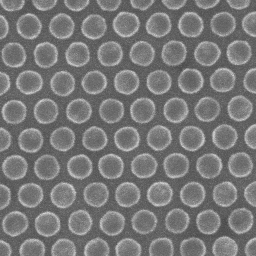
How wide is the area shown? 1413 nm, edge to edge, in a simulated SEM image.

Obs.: a regular array of raised bodies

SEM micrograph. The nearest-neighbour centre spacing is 174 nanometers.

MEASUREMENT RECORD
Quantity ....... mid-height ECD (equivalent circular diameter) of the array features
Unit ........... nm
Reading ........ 132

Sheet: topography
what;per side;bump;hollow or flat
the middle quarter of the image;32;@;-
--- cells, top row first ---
--------------------------------
------------------------------@@
@-----@@@-----@@@@----@@@@---@@@
@@---@@@@@---@@@@@---@@@@@@--@@@
@@@--@@@@@---@@@@@@--@@@@@@--@@@
@@@--@@@@@---@@@@@---@@@@@---@@@
@@---@@@@@---@@@@@----@@@@----@@
@--------------@----------------
----------------------------@---
--@@@@----@@@@----@@@@----@@@@--
-@@@@@---@@@@@@--@@@@@---@@@@@--
-@@@@@@--@@@@@@--@@@@@@--@@@@@@-
-@@@@@---@@@@@@--@@@@@@--@@@@@@-
-@@@@@---@@@@@---@@@@@----@@@@--
--@@@------@@-----@@@-----------
--------------------------------
@@----@@@-----@@@@----@@@@----@@
@@---@@@@@---@@@@@---@@@@@@--@@@
@@@--@@@@@---@@@@@@--@@@@@@--@@@
@@---@@@@@@--@@@@@---@@@@@@--@@@
@@---@@@@@---@@@@@----@@@@----@@
@--------------@---------------@
--------------------------------
--@@@@---@@@@@----@@@@----@@@@@-
-@@@@@@--@@@@@---@@@@@@--@@@@@@-
-@@@@@@--@@@@@@--@@@@@@--@@@@@@-
-@@@@@@--@@@@@@--@@@@@@--@@@@@@-
--@@@@----@@@@----@@@@----@@@@--
----@---------------------------
--------------------------------
@@----@@@@----@@@@----@@@@----@@
@@---@@@@@@--@@@@@@--@@@@@@--@@@